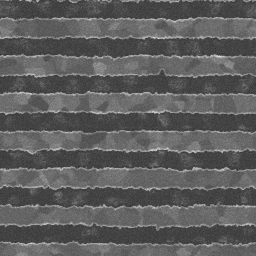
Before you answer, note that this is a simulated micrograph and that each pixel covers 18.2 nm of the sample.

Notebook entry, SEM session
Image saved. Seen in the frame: parallel lines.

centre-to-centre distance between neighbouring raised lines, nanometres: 682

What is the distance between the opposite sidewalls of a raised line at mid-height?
0.339 microns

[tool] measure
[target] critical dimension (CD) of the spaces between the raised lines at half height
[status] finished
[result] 18.6 pixels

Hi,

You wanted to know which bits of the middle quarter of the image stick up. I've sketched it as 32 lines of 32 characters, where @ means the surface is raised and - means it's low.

@@@@@@@@@@@@@@@@@@@@@@@@@@@@@@@@
@@@@@@@@@@@@@@@@@@@@@@@@-@@@@@@@
@@@@@@@@@@@@@@@@@@@@@@@@-@@@@@@@
--------------------------------
--------------------------------
--------------------------------
--------------------------------
--@@-@@@@@@@@@@@@@@@@@@@-@------
@@@@@@@@@@@@@@@@@@@@@@@@@@@@@@@@
@@@@@@@@@@@@@@@@@@@@@@@@@@@@@@@@
@@@@@@@@@@@@@@@@@@@@@@@@@@@@@@@@
@@@@@@@@@@@@@@@@@@@@@@@@@@@@@@@@
--------------------------------
--------------------------------
--------------------------------
--------------------------------
--------------------------------
@@@@@@@@@@@@@@@@@@@@@@@@@@@@@@@@
@@@@@@@@@@@@@@@@@@@@@@@@@@@@@@@@
@@@@@@@@@@@@@@@@@@@@@@@@@@@@@@@@
@@@@@@@@@@@@@@@@@@@@@@@@@@@@@@@@
-@--------@@@@@@@@@@@@@---@@@@@@
--------------------------------
--------------------------------
--------------------------------
--------------------------------
@@@@@@@@@@@@@@@@@@@@@@@@@@@@----
@@@@@@@@@@@@@@@@@@@@@@@@@@@@@@@@
@@@@@@@@@@@@@@@@@@@@@@@@@@@@@@@@
@@@@@@@@@@@@@@@@@@@@@@@@@@@@@@@@
@@@@@@@@@@@@@@@@@@@@@@@@@@@@@@@@
--------------------------------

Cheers